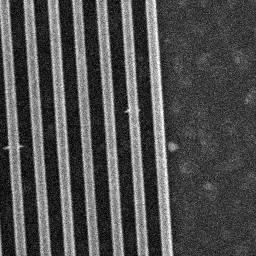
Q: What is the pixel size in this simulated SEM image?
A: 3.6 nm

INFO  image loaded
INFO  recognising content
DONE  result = parallel lines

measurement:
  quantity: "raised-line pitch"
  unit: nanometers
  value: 87.6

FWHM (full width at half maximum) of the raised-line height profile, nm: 33.7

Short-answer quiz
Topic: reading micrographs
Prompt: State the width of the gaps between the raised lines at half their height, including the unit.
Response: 55.2 nm